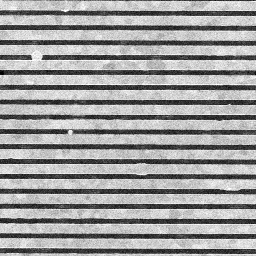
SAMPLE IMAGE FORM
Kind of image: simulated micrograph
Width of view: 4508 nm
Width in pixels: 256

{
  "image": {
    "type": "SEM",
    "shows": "parallel lines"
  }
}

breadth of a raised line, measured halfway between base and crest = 0.163 µm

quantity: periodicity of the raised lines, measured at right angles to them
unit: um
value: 0.262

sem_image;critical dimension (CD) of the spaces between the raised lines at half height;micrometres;0.101